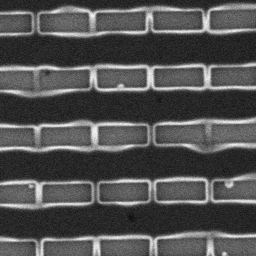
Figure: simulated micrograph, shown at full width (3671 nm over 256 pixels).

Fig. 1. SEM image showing an array of small figures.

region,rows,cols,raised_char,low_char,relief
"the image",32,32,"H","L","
HHHHHHHHHHHHHHHHHHHHHHHHHHHHHHHH
HHHHHHHLLLLHLLLLLLHLLLLLLHLLLLLL
LLLLHLLLLLLLLLLLLLHLLLLLLHLLLLLL
LLLLHLLLLLLLLLLLLLHLLLLLLHLLLLLL
HHHHHHHHHHHHHHHHHHHHHHHHHHHHHHHH
HHHHHHHHHHHHHHHHHHHHHHHHHHHHHHHH
HHHHHHHHHHHHHHHHHHHHHHHHHHHHHHHH
HHHHHHHHHHHHHHHHHHHHHHHHHHHHHHHH
HHHHHLHHHHLHLLLLLLHHLLLLLHHLLLLL
LLLLLLLLLLLLLLLLLLLLLLLLLLLLLLLL
LLLLLLLLLLLHLLLLLLHLLLLLLLLLLLLL
HHLLLLLHHHHHHHHHHHHHHHHHHHHHHHHH
HHHHHHHHHHHHHHHHHHHHHHHHHHHHHHHH
HHHHHHHHHHHHHHHHHHHHHHHHHHHHHHHH
HHHHHHHHHHHHHHHHHHHHHHHHHHHHHHHH
HHHHHHHHHLLHHHLHHHHHLLLLLLLLLLLL
LLLLLLLLLLLLLLLLLLLLLLLLLLLLLLLL
LLLLLLLLLLLLLLLLLLLLLLLLLLLLLLLL
LLLLLLHHHLLHHLLHHHHHHHHHHLHHHHHH
HHHHHHHHHHHHHHHHHHHHHHHHHHHHHHHH
HHHHHHHHHHHHHHHHHHHHHHHHHHHHHHHH
HHHHHHHHHHHHHHHHHHHHHHHHHHHHHHHH
HHHHHHHHHHHHHHHHHHHHHLLLLHHHHLLL
LLLLLLLLLLLLLLLLLLLLLLLLLLHLLLLL
LLLLLLLLLLLLLLLLLLLLLLLLLLHLLLLL
LLLLLLLLLHHHHHHHHHHHHHHHHHHHHHHH
HHHHHHHHHHHHHHHHHHHHHHHHHHHHHHHH
HHHHHHHHHHHHHHHHHHHHHHHHHHHHHHHH
HHHHHHHHHHHHHHHHHHHHHHHHHHHHHHHH
HHHHHHHHHHHHHHHHHHHHHHHLLLLLLHHL
LLLLHLLLLLLLLLLLLLLLLLLLLLLLLLLL
LLLLLLLLLLLLLLLLLLLHLLLLLLHLLLLL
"